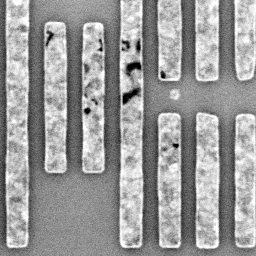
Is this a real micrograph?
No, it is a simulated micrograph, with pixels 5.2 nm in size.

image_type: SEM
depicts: wiring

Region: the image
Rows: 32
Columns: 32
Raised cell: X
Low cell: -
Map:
-XX------------XXX--XX---XX--XXX
-XX------------XXX--XXX--XX---XX
-XX------------XXX--XXX--XX---XX
-XX---XX---XX--XXX--XXX--XX---XX
-XX---XX---XX--XXX--XXX--XX---XX
-XX---XX---XX--XXX--XXX--XX---XX
-XX---XX--XXX--XXX--XXX--XX---XX
-XX---XX--XXX--XXX--XXX--XX---XX
-XX---XX--XXX--XXX--XX---XX---XX
-XX---XX--XXX--XXX--XX---XX---X-
-XX---XX--XXX--XXX--------------
-XX---XX--XXX--XXX--------------
-XX---XX--XXX--XXX--------------
-XX---XX--XXX--XXX--------------
-XX---XX--XXX--XXX--XX---XX---XX
-XX---XX--XXX--XXX--XX---XX---XX
-XX---XX---XX--XXX--XX---XX---XX
-XX---XX---XX--XXX--XX---XX---XX
-XX---XX--XXX--XXX--XX---XX---XX
-XX---XX--XXX--XXX--XX---XX---XX
-XX---XX--XXX--XXX--XX---XX---XX
-XX------------XXX--XX---XX---XX
-XX------------XXX--XX---XX---XX
-XX------------XXX--XX---XX---XX
-XX------------XXX--XX---XX---XX
-XX------------XXX--XX---XX---XX
-XX------------XXX--XX---XX---XX
-XX------------XXX--XX---XX---XX
-XX------------XXX--XX---XX---XX
-XX------------XXX--XX---XX---XX
-XX------------XXX--XX---XX---XX
--------------------------------